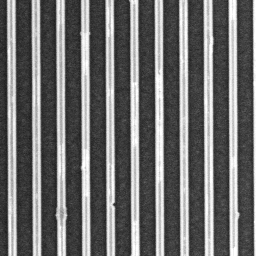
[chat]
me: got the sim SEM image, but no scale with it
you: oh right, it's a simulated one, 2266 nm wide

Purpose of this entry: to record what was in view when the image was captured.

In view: parallel lines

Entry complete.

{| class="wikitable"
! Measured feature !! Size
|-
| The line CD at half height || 56.4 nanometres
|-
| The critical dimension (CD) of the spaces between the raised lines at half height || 162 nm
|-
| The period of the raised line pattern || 218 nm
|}